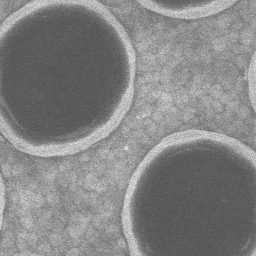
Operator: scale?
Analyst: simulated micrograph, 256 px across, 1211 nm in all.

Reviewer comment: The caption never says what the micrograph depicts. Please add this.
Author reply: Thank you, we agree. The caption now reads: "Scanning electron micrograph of raised bodies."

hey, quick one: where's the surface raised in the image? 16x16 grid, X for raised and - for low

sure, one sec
--XXXX----XXX---
-XXXXXX---------
XXXXXXXX--------
XXXXXXXX--------
XXXXXXXX--------
XXXXXXXX--------
XXXXXXXX--------
XXXXXXX---------
-XXXXX------X---
----------XXXXX-
---------XXXXXXX
--------XXXXXXXX
--------XXXXXXXX
--------XXXXXXXX
--------XXXXXXXX
--------XXXXXXXX